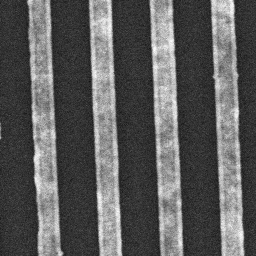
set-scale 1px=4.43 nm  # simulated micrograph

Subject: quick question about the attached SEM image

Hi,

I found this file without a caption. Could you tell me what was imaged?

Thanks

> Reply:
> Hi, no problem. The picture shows one or a few lines or trenches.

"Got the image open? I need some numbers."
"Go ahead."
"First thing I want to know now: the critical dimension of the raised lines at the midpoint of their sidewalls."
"0.0824 um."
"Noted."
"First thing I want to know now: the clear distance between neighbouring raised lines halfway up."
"189 nm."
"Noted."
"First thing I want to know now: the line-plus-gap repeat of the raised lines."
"271 nm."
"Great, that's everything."